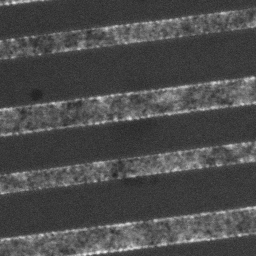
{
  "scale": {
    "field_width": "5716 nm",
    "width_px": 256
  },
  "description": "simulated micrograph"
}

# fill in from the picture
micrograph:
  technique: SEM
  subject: lines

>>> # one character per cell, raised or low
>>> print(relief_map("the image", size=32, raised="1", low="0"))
10000000000000000000000000000000
00000000000000000000000000001111
00000000000000000000011111111111
00000000000001111111111111111100
00001111111111111111111000000000
11111111111111100000000000000000
11111110000000000000000000000000
00000000000000000000000000000000
00000000000000000000000000000000
00000000000000000000000000000000
00000000000000000000000001111111
00000000000000000011111111111111
00000000011111111111111111111111
00111111111111111111111111100000
11111111111111111110000000000000
11111111111100000000000000000000
11110000000000000000000000000000
00000000000000000000000000000000
00000000000000000000000000111111
00000000000000000001111111111111
00000000000111111111111111111000
00001111111111111111100000000000
11111111111110000000000000000000
11111100000000000000000000000000
00000000000000000000000000000000
00000000000000000000000000000000
00000000000000000000000000011111
00000000000000000000111111111111
00000000000111111111111111111111
00001111111111111111111111111000
11111111111111111111100000000000
11111111111110000000000000000000